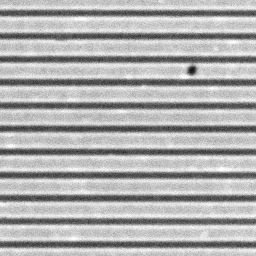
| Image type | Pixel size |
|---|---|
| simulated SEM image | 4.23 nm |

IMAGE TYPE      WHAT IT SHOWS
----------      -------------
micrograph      parallel lines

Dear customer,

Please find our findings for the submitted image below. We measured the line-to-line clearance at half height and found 0.0317 um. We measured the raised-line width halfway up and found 63.9 nanometers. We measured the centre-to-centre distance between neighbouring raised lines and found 97.8 nanometres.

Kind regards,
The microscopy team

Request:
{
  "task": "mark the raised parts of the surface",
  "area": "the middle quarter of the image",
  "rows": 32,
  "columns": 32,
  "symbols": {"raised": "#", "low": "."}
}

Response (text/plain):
################################
################################
################################
.....###########################
................................
....................#...........
################################
################################
################################
................................
................................
................................
################################
################################
################################
................................
................................
################################
################################
################################
################################
................................
................................
################################
################################
################################
################################
................................
................................
################################
################################
################################